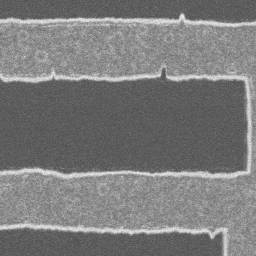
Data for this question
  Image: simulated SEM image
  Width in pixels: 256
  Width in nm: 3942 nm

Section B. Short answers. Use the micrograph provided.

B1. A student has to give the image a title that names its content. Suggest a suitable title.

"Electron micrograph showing one or a few lines or trenches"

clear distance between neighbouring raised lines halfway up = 1480 nanometers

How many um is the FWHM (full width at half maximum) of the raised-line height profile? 0.88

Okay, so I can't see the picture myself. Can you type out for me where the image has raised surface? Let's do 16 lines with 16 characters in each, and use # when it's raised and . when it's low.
................
##############.#
################
################
################
...............#
................
................
................
................
...............#
################
################
################
.............###
..............##